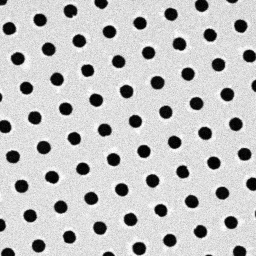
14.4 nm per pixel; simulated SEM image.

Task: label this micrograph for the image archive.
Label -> a regular array of holes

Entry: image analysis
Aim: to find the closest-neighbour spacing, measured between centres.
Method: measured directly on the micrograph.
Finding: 0.443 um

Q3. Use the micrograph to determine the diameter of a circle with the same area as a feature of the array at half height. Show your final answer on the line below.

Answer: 0.192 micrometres